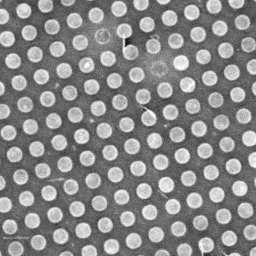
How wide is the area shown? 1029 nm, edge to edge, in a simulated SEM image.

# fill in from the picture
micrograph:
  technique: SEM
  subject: a regular array of raised bodies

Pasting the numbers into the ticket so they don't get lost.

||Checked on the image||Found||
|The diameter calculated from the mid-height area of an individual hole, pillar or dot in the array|15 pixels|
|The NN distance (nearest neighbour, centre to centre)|90.8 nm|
